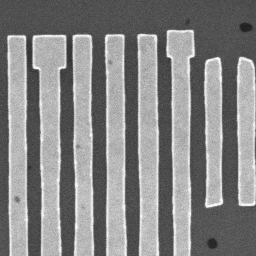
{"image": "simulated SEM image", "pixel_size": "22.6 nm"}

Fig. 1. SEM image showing wiring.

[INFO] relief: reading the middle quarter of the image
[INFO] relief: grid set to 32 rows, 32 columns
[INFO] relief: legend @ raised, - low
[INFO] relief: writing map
--@@@@@----@@@@----@@@@----@@@@-
--@@@@@----@@@@----@@@@----@@@@-
--@@@@@----@@@@----@@@@----@@@@-
--@@@@@----@@@@----@@@@----@@@@-
--@@@@@----@@@@----@@@@----@@@@-
--@@@@@----@@@@----@@@@----@@@@-
--@@@@@----@@@@----@@@@----@@@@-
---@@@@----@@@@----@@@@----@@@@-
---@@@@----@@@@----@@@@----@@@@-
---@@@@----@@@@----@@@@----@@@@-
---@@@@----@@@@----@@@@----@@@@-
---@@@@----@@@@----@@@@----@@@@-
---@@@@----@@@@----@@@@----@@@@-
---@@@@----@@@@----@@@@----@@@@-
---@@@@----@@@@----@@@@----@@@@-
---@@@@----@@@@----@@@@----@@@@-
---@@@@----@@@@----@@@@----@@@@-
---@@@@----@@@@----@@@@----@@@@-
---@@@@----@@@@----@@@@----@@@@-
---@@@@----@@@@----@@@@----@@@@-
---@@@@----@@@@----@@@@----@@@@-
---@@@@----@@@@----@@@@----@@@@-
---@@@@----@@@@----@@@@----@@@@-
---@@@@----@@@@----@@@@----@@@@-
---@@@@----@@@@----@@@@----@@@@-
---@@@@----@@@@----@@@@----@@@@-
---@@@@----@@@@----@@@@----@@@@-
---@@@@----@@@@----@@@@----@@@@-
---@@@@----@@@@----@@@@----@@@@-
---@@@@----@@@@----@@@@----@@@@-
---@@@@----@@@@----@@@@----@@@@@
---@@@@----@@@@----@@@@----@@@@@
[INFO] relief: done